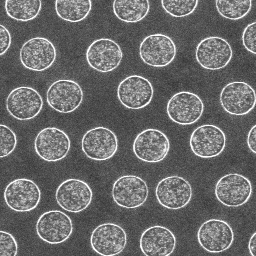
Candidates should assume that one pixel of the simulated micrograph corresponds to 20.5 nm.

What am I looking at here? a regular array of raised bodies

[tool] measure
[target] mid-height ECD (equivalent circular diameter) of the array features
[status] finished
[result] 680 nm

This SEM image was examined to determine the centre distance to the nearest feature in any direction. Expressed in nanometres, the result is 971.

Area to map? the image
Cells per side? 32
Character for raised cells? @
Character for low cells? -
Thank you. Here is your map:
-@@@@--@@@@---@@@@@-@@@@---@@@@-
-@@@@--@@@@---@@@@---@@@---@@@@-
--------@@-----@@---------------
@------------------------------@
@------------------@@---------@@
@--@@@------@@----@@@@---@@@---@
---@@@@----@@@@---@@@@---@@@@---
---@@@@----@@@@---@@@----@@@@---
----@@------@@------------@@----
--------------------------------
-------@@------@@@@----------@@-
--@@--@@@@-----@@@@---------@@@@
-@@@@-@@@@-----@@@@--@@@@---@@@@
-@@@@--@@-------@----@@@@---@@@-
--@@-----------------@@@@-------
--------------------------------
@----@@@---@@@----@@----@@@@---@
@@---@@@@-@@@@---@@@@---@@@@---@
@@---@@@@-@@@@---@@@@---@@@@---@
-----@@@---@@@---@@@@----@@-----
--------------------------------
--------------------------------
---------------@@@--@@@-----@@@-
-@@@@--@@@@---@@@@--@@@@---@@@@-
-@@@@--@@@@---@@@@--@@@@---@@@@-
-@@@@--@@@@----@@@--@@@-----@@--
------@-------------------------
-----@@@@-----------------------
-----@@@@---@@@----@-----@@@@---
@----@@@@--@@@@@--@@@@---@@@@---
@@---------@@@@@--@@@@---@@@@--@
@@----------@@@---@@@----------@